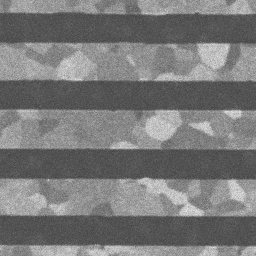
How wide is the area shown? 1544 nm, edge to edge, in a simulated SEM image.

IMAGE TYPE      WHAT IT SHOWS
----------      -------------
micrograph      one or a few lines or trenches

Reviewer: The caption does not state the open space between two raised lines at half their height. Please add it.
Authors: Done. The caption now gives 30.9 px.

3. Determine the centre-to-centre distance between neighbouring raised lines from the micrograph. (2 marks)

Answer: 408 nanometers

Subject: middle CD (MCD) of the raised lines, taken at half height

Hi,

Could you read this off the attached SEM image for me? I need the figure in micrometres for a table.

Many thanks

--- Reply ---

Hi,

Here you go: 0.221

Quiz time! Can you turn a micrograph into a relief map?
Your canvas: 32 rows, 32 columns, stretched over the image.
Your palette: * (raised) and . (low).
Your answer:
********************************
*.*****...**************.*******
................................
................................
................................
.............****...............
********************************
********************************
********************************
********************************
................................
................................
................................
................................
********************************
********************************
********************************
********************************
.....*...................*******
................................
................................
................................
***....*****************..*.....
********************************
********************************
********************************
********************************
................................
................................
................................
................................
********************************